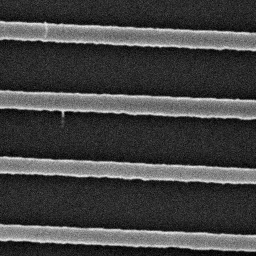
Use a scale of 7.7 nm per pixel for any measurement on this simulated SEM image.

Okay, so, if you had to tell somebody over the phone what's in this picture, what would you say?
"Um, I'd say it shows lines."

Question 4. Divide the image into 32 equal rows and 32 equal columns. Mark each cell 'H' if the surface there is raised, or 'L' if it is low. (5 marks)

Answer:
LLLLLLLLLLLLLLLLLLLLLLLLLLLLLLLL
LLLLLLLLLLLLLLLLLLLLLLLLLLLLLLLL
LLLLLLLLLLLLLLLLLLLLLLLLLLLLLLLL
HHHHHHHHHHHHHHHHHLLLLLLLLLLLLLLL
HHHHHHHHHHHHHHHHHHHHHHHHHHHHHHHH
LLLLLLLLLLLLLLHHHHHHHHHHHHHHHHHH
LLLLLLLLLLLLLLLLLLLLLLLLLLLLLLLL
LLLLLLLLLLLLLLLLLLLLLLLLLLLLLLLL
LLLLLLLLLLLLLLLLLLLLLLLLLLLLLLLL
LLLLLLLLLLLLLLLLLLLLLLLLLLLLLLLL
LLLLLLLLLLLLLLLLLLLLLLLLLLLLLLLL
HHHLLLLLLLLLLLLLLLLLLLLLLLLLLLLL
HHHHHHHHHHHHHHHHHHHHHHHHHHHHHHLL
LLHHHHHHHHHHHHHHHHHHHHHHHHHHHHHH
LLLLLLLLLLLLLLLLLLLLLHLHHHHHHHHH
LLLLLLLLLLLLLLLLLLLLLLLLLLLLLLLL
LLLLLLLLLLLLLLLLLLLLLLLLLLLLLLLL
LLLLLLLLLLLLLLLLLLLLLLLLLLLLLLLL
LLLLLLLLLLLLLLLLLLLLLLLLLLLLLLLL
LLLLLLLLLLLLLLLLLLLLLLLLLLLLLLLL
HHHHHHHHHHHHHHHHHHHLLLLLLLLLLLLL
HHHHHHHHHHHHHHHHHHHHHHHHHHHHHHHH
LLLLLLLLLLLLLLLLLLLLLLHHHHHHHHHH
LLLLLLLLLLLLLLLLLLLLLLLLLLLLLLLL
LLLLLLLLLLLLLLLLLLLLLLLLLLLLLLLL
LLLLLLLLLLLLLLLLLLLLLLLLLLLLLLLL
LLLLLLLLLLLLLLLLLLLLLLLLLLLLLLLL
LLLLLLLLLLLLLLLLLLLLLLLLLLLLLLLL
HHHHHHHHHLLLLLLLLLLLLLLLLLLLLLLL
HHHHHHHHHHHHHHHHHHHHHHHHHHHHHHHH
LLLLLLLLLLHHHHHHHHHHHHHHHHHHHHHH
LLLLLLLLLLLLLLLLLLLLLLLLLLLLLLLL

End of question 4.